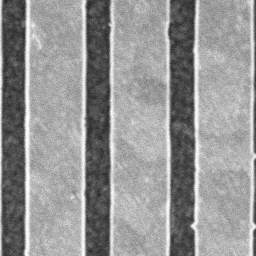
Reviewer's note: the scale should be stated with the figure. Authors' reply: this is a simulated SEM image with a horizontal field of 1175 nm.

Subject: one or a few lines or trenches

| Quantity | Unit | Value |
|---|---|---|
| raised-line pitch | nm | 387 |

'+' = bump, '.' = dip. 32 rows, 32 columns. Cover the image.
....++++++....+++++++....+++++++
....++++++....+++++++....+++++++
....+++++++...+++++++....+++++++
....++++++....+++++++....+++++++
....++++++....+++++++....+++++++
....++++++....+++++++....+++++++
...++++++++...+++++++...+++++++.
...++++++++...+++++++....+++++++
...++++++++...+++++++....+++++++
...+++++++....+++++++....+++++++
...+++++++....+++++++....+++++++
...+++++++....+++++++...+++++++.
...++++++++...+++++++....++++++.
....+++++++...+++++++....++++++.
...+++++++....+++++++....++++++.
...+++++++....+++++++....++++++.
...+++++++....+++++++....++++++.
...+++++++....+++++++....++++++.
...+++++++....+++++++....++++++.
...+++++++....+++++++....+++++++
...+++++++....+++++++....++++++.
...+++++++....+++++++....+++++++
...+++++++....+++++++....++++++.
...+++++++....+++++++....++++++.
...+++++++....+++++++....++++++.
...+++++++....+++++++....++++++.
...+++++++....+++++++....++++++.
...+++++++....+++++++...++++++++
...+++++++....+++++++...++++++++
...+++++++....+++++++....+++++++
...+++++++....+++++++....++++++.
...+++++++....+++++++....++++++.